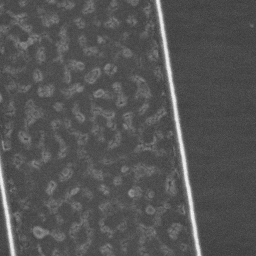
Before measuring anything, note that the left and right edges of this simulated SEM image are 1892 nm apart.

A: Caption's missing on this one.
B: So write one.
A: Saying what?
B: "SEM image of one or a few lines or trenches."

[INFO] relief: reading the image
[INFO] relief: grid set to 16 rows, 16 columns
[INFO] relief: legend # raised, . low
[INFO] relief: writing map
..........######
..........######
..........######
..........######
...........#####
...........#####
...........#####
...........#####
...........#####
...........#####
............####
............####
............####
............####
#...........####
#...........####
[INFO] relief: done